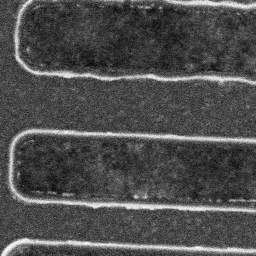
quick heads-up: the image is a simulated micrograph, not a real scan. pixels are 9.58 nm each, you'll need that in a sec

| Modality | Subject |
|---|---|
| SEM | one or a few lines or trenches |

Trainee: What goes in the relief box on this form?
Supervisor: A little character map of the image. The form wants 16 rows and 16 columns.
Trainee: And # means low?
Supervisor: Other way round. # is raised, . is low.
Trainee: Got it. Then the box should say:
#...............
#...............
#...............
#...............
##..............
################
################
################
#........#######
#...............
#...............
#...............
##..............
################
################
#..........#####